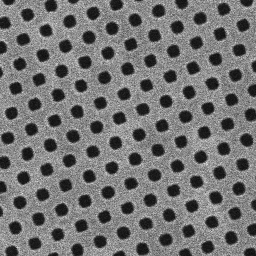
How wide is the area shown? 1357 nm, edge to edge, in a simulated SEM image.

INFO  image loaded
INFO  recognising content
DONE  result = a regular array of holes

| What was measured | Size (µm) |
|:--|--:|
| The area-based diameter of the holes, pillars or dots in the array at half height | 0.0708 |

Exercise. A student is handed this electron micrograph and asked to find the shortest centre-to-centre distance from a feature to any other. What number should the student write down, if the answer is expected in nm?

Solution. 130